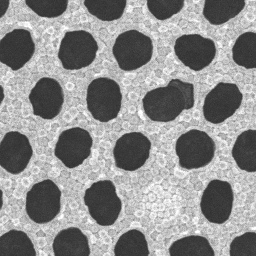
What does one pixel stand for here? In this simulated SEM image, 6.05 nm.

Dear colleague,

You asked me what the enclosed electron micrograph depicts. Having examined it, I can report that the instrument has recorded a regular array of holes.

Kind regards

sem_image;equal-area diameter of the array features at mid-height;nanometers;238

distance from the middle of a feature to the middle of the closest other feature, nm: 336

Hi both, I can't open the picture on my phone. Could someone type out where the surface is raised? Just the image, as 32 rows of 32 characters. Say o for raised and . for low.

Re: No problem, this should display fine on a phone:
.oo.....ooo.....oo.....ooo.....o
.ooo....ooo....oooo...ooo.....oo
ooooooooooooo.oooooooooooo...ooo
oooooooooooooooooooooooooooooooo
....oooo....ooo...ooooo..ooooo..
....oooo....oo.....ooo.....oo...
....ooo.....oo.....ooo.....oo...
....ooo.....ooo....ooo.....oo...
o..ooooo..ooooo..ooooooo.oooooo.
oooooooooooooooooooooooooooooooo
oooo...oooo....oooooo...ooo..ooo
oooo....ooo....oooo.....oo....oo
oooo....ooo....ooo......oo....oo
oooo....ooo....ooo......o.....oo
ooooo..ooooo...ooo....oooo...ooo
oooooooooooooooooooooooooooooooo
o.oooooo...oooooooooooo...oooo..
....ooo.....ooo....ooo.....ooo..
....ooo....ooo.....ooo.....oo...
....ooo....ooo.....ooo.....oo...
...ooooo..oooo....oooo....oooo..
o..oooooooooooooooooooooooooooo.
ooooooooooooooooooooooooooo.oooo
oooo...oooo...oooooooooooo...ooo
ooo.....oo.....oooooooooo....ooo
ooo.....ooo....oooooooooo....ooo
ooo....oooo....oooooooooo....ooo
oooo..oooooo...ooooooooooo..oooo
ooooooooo.oooooooooooooooooooooo
...oooo....oooo...ooooo..ooooo..
....ooo....ooo....oooo....ooo...
....ooo....ooo.....oo......oo...